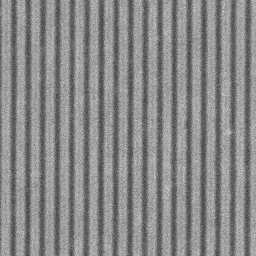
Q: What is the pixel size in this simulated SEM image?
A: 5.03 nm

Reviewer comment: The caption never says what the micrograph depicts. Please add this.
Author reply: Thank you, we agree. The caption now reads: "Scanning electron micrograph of parallel lines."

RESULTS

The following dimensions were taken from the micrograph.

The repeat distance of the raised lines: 73.6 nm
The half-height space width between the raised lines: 33.3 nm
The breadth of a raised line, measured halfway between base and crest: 37.7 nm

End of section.